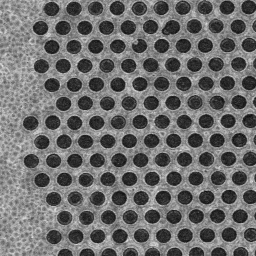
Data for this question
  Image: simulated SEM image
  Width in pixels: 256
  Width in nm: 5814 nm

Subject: a regular array of holes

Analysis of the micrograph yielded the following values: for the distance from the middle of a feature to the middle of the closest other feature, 489 nanometers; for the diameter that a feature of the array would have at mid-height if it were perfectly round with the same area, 0.346 µm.